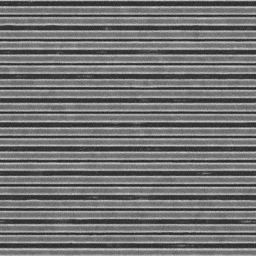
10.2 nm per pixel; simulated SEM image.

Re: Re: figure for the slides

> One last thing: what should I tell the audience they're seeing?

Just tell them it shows parallel lines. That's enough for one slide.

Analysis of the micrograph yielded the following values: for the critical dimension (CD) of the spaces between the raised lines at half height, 61.1 nanometres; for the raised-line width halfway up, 70.1 nanometers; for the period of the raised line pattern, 0.123 um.